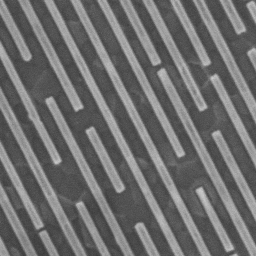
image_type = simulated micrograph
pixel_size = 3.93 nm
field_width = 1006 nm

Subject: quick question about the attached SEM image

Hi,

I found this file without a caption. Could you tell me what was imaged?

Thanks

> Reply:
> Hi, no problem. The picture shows parallel lines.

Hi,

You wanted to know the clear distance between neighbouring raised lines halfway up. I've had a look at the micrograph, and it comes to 14.1 pixels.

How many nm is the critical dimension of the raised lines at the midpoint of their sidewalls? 31.5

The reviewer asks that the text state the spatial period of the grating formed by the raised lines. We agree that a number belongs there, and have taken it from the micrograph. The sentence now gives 0.0874 um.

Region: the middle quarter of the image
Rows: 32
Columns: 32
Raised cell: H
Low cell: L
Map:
LLLLHHLLLLHHLLLLLHHLLLLLLLLLHHLL
LLLLHHLLLLLHHLLLLHHHLLLLHLLLLHHL
LLLLLHHLLLLHHLLLLLHHLLLHHHLLLHHL
HLLLLHHLLLLLHHLLLLHHHLLLHHLLLLHH
HHLLLLHHLLLLHHLLLLLHHLLLHHHLLLHH
HHLLLLHHLLLLLHHLLLLLHHLLLHHLLLLH
HHHLLLLHHLLLLHHLLLLLHHLLLHHHLLLH
LHHLLLLHHLLLLLHHLLLLLHHLLLHHLLLL
LHHHLLLLHHLLLLHHLLLLLHHLLLHHHLLL
LLHHLLLLHHLLLLLHHLLLLLHHLLLHHLLL
LLHHHLLLLHHLLLLHHLLLLLHHLLLLHHLL
LLLHLLLLLHHLLLLLHHLLLLLHHLLLHHLL
LLLLLLLLLLHHLLLLHHHLLLLHHLLLLHHL
LLLLLLLLLLHHLLLLLHHLLLLLHHLLLHHL
LLLLLLLLLLLHHLLLLHHHLLLLHHLLLLHH
HLLLLLLLLLLHHLLLLLHHLLLLLHHLLLHH
HLLLLLHHLLLLHHLLLLHHHLLLLHHLLLLH
HHLLLLHHLLLLHHLLLLLHHLLLLLHHLLLH
HHLLLLHHHLLLLHHLLLLHHHLLLLHHLLLL
LHHLLLLHHLLLLHHLLLLLHHLLLLLHHLLL
LHHLLLLHHHLLLLHHLLLLLHHLLLLHHLLL
LLHHLLLLHHLLLLHHLLLLLHHLLLLLHHLL
LLHHLLLLHHHLLLLHHLLLLLHHLLLLHHLL
LLLHHLLLLHHLLLLHHLLLLLHHLLLLLLLL
LLLHHLLLLHHHLLLLHHLLLLLHHLLLLLLL
LLLLHHLLLLHHLLLLHHLLLLLHHLLLLLLL
LLLLHHLLLLHHHLLLLHHLLLLLHHLLLLLL
LLLLLHHLLLLHHLLLLHHHLLLLHHLLLLLL
LLLLLHHLLLLHHHLLLLHHLLLLLHHLLLLL
LLLLLLHHLLLLHHLLLLHHHLLLLHHLLLLL
LLLLLLHHLLLLHHHLLLLHHLLLLLHHLLLL
LLLLLLLHHLLLLHHLLLLHHLLLLLHHLLLL